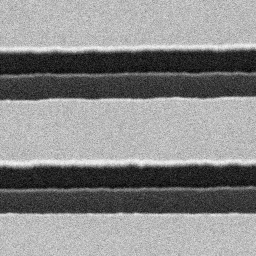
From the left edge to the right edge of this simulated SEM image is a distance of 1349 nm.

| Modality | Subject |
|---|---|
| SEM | lines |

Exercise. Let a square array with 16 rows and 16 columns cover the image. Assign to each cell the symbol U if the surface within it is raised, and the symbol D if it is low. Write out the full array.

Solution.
UUUUUUUUUUUUUUUU
UUUUUUUUUUUUUUUU
UUUUUUUUUUUUUUUU
DDDDDDDDDDDDDDDD
DDDDDDDDDDDDDDDD
DDDDDDDDDDDDDDDD
UUUUUUUUUUUUUUUU
UUUUUUUUUUUUUUUU
UUUUUUUUUUUUUUUU
UUUUUUUUUUUUUUUU
DDDDDDDDDDDDDDDD
DDDDDDDDDDDDDDDD
DDDDDDDDDDDDDDDD
UUUUUUUUUUUUUUUU
UUUUUUUUUUUUUUUU
UUUUUUUUUUUUUUUU